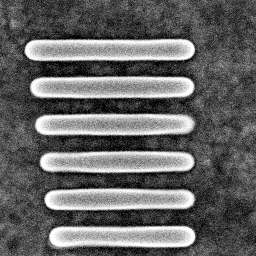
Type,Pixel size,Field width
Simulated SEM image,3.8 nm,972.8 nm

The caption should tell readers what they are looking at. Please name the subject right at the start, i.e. groups of lines, slits or small figures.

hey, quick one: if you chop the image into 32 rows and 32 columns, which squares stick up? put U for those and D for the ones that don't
DDDDDDDDDDDDDDDDDDDDDDDDDDDDDDDD
DDDDDDDDDDDDDDDDDDDDDDDDDDDDDDDD
DDDDDDDDDDDDDDDDDDDDDDDDDDDDDDDD
DDDDDDDDDDDDDDDDDDDDDDDDDDDDDDDD
DDDDDDDDDDDDDDDDDDDDDDDDDDDDDDDD
DDDDUUUUUUUUUUUUUUUUUUUUDDDDDDDD
DDDUUUUUUUUUUUUUUUUUUUUUDDDDDDDD
DDDDDDDDDDDDDDDDDDDDDDDDDDDDDDDD
DDDDDDDDDDDDDDDDDDDDDDDDDDDDDDDD
DDDDDDDDDDDDDDDDDDDDDDDDDDDDDDDD
DDDDUUUUUUUUUUUUUUUUUUUUDDDDDDDD
DDDDUUUUUUUUUUUUUUUUUUUUDDDDDDDD
DDDDDDDDDDDDDDDDDDDDDDDDDDDDDDDD
DDDDDDDDDDDDDDDDDDDDDDDDDDDDDDDD
DDDDDDDDDDUUUUUUUUUUDDDDDDDDDDDD
DDDDDUUUUUUUUUUUUUUUUUUUDDDDDDDD
DDDDDUUUUUUUUUUUUUUUUUUDDDDDDDDD
DDDDDDDDDDDDDDDDDDDDDDDDDDDDDDDD
DDDDDDDDDDDDDDDDDDDDDDDDDDDDDDDD
DDDDDDUUUUUUUUUUUUUUUUUUDDDDDDDD
DDDDDUUUUUUUUUUUUUUUUUUUDDDDDDDD
DDDDDDDDDDDDDDDDDDDDDDDDDDDDDDDD
DDDDDDDDDDDDDDDDDDDDDDDDDDDDDDDD
DDDDDDDDDDDDDDDDDDDDDDDDDDDDDDDD
DDDDDDUUUUUUUUUUUUUUUUUUDDDDDDDD
DDDDDDUUUUUUUUUUUUUUUUUUDDDDDDDD
DDDDDDDDDDDDDDDDDDDDDDDDDDDDDDDD
DDDDDDDDDDDDDDDDDDDDDDDDDDDDDDDD
DDDDDDDUUUUUUDDDUUUUUUUDDDDDDDDD
DDDDDDUUUUUUUUUUUUUUUUUUDDDDDDDD
DDDDDDDUUUUUUUUUUUUUUUUUDDDDDDDD
DDDDDDDDDDDDDDDDDDDDDDDDDDDDDDDD